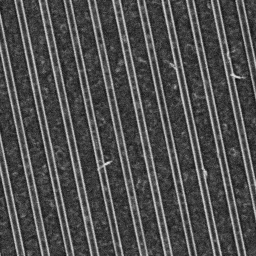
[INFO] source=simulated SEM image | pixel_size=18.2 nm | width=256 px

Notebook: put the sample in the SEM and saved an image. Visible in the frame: parallel lines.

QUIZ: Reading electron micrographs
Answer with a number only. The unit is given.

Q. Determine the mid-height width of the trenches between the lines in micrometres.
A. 0.317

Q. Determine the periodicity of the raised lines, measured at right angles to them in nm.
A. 440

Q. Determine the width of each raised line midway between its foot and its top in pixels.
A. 6.74